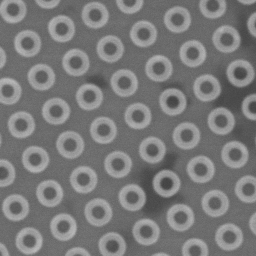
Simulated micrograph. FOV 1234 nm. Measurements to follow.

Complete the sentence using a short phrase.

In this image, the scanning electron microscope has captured a regular array of ring-shaped raised bodies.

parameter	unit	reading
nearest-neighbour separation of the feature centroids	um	0.174